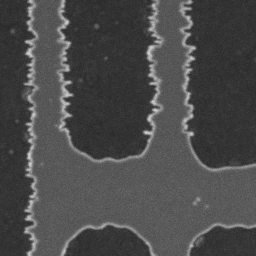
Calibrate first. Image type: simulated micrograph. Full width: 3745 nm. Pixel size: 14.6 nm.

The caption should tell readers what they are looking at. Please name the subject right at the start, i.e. one or a few lines or trenches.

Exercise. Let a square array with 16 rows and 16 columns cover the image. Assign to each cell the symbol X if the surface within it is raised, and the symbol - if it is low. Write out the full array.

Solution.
--XX------XX----
--XX-----XXX----
--XX------XX----
--XX-----XXX----
--XX-----XXX----
--XX------XX----
--XX------XX----
--XX-----XXX----
--XX-----XXX----
--XXX----XXX----
--XXXXXXXXXXXXXX
--XXXXXXXXXXXXXX
--XXXXXXXXXXXXXX
--XXXXXXXXXXXXXX
--XXX---XXXXX---
--XX-----XXX----